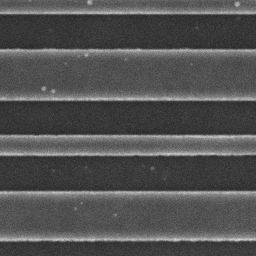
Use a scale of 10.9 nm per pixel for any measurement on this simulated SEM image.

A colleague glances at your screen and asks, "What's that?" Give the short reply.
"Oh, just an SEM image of lines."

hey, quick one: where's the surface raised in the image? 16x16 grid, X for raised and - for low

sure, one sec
XXXXXXXXXXXXXXXX
----------------
----------------
XXXXXXXXXXXXXXXX
XXXXXXXXXXXXXXXX
XXXXXXXXXXXXXXXX
----------------
----------------
XXXXXXXXXXXXXXXX
XXXXXXXXXXXXXXXX
----------------
----------------
XXXXXXXXXXXXXXXX
XXXXXXXXXXXXXXXX
XXXXXXXXXXXXXXXX
----------------